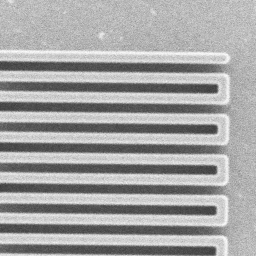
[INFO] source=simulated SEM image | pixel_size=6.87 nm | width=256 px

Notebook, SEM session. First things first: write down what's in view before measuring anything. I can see groups of lines, slits or small figures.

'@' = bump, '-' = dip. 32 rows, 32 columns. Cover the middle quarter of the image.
--------------------------------
--------------------------------
@@@@@@@@@@@@@@@@@@@@@@@@@@@@@@@@
@@@@@@@@@@@@@@@@@@@@@@@@@@@@@@@@
--------------@@@@@@@@@@@@@@@@@@
--------------------------------
--------------------------------
@@@@@@@@@@@@@@@@@@@@@@@@@@@@@@@@
@@@@@@@@@@@@@@@@@@@@@@@@@@@@@@@@
@@@@@@@@@@@@@@@@@@@@@@@@@@@@@@@@
--------------------------------
--------------------------------
@@@@@@@@@@@@@@@@@---------------
@@@@@@@@@@@@@@@@@@@@@@@@@@@@@@@@
@@@@@@@@@@@@@@@@@@@@@@@@@@@@@@@@
--------------------------------
--------------------------------
@@@@@@@@@@@@@@@@----------------
@@@@@@@@@@@@@@@@@@@@@@@@@@@@@@@@
@@@@@@@@@@@@@@@@@@@@@@@@@@@@@@@@
--------------------------------
--------------------------------
@@@@@@@@@@@@@@@@----------------
@@@@@@@@@@@@@@@@@@@@@@@@@@@@@@@@
@@@@@@@@@@@@@@@@@@@@@@@@@@@@@@@@
--------------------------------
--------------------------------
--------------------------------
@@@@@@@@@@@@@@@@@@@@@@@@@@@@@@@@
@@@@@@@@@@@@@@@@@@@@@@@@@@@@@@@@
--------------------------------
--------------------------------